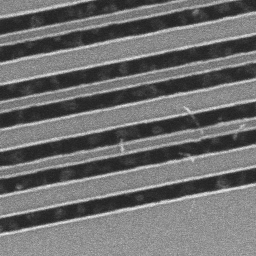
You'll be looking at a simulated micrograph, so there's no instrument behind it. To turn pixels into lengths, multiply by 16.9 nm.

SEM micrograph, parallel lines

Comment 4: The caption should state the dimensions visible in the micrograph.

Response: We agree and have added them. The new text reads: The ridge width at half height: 310 nm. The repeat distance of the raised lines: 559 nm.